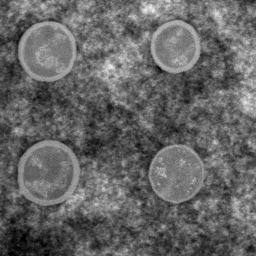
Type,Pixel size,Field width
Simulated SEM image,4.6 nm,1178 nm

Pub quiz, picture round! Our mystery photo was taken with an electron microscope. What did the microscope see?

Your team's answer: raised bodies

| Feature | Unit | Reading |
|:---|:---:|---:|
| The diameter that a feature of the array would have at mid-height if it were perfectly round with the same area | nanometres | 247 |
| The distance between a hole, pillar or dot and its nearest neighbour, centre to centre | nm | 568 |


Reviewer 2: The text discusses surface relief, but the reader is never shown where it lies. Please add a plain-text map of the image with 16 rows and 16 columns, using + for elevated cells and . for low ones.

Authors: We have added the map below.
................
................
.++++.....++....
.++++.....++....
..++............
................
................
................
................
..++......++....
.++++....++++...
.++++.....+++...
..++............
................
................
................